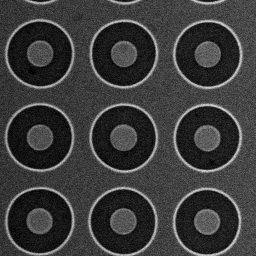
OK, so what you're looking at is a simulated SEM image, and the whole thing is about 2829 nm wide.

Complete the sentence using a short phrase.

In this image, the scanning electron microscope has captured an array of small figures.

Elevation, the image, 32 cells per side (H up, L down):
HHHHHHHHHHHHHHHHHHHHHHHHHHHHHHHH
HHHHHHHHHHHHHHHHHHHHHHHHHHHHHHHH
HHHHHHHHHHHHHHHHHHHHHHHHHHHHHHHH
HHLLLLLLHHHHHLLLLLHHHHHHLLLLHHHH
HHLLLLLLHHHHLLLLLLLHHHHLLLLLLHHH
HLLLHHLLLHHHLLLHLLLHHHLLLLHLLLHH
HLLLHHLLLHHLLLHHHLLLHHLLHHHHLLHH
HLLLHHLLLHHLLLHHHLLHHHLLLHHLLLHH
HLLLLLLLLHHHLLLLLLLHHHLLLLLLLLHH
HHLLLLLLHHHHLLLLLLHHHHHLLLLLLHHH
HHHLLLLHHHHHHHLLLHHHHHHHLLLLHHHH
HHHHHHHHHHHHHHHHHHHHHHHHHHHHHHHH
HHHHHHHHHHHHHHHHHHHHHHHHHHHHHHHH
HHHLLLLHHHHHHHLLLHHHHHHHLLLHHHHH
HHLLLLLLHHHHLLLLLLLHHHHLLLLLLHHH
HLLLLLLLLHHHLLLLLLLHHHLLLLLLLLHH
HLLLHHLLLHHLLLHHHLLHHHLLLHHLLLHH
HLLLHHLLLHHLLLHHHLLLHHLLHHHLLLHH
HLLLHHLLLHHHLLLHLLLHHHLLLHHLLLHH
HHLLLLLLHHHHLLLLLLLHHHHLLLLLLHHH
HHHLLLLHHHHHHLLLLLHHHHHLLLLLHHHH
HHHHHHHHHHHHHHHHHHHHHHHHHHHHHHHH
HHHHHHHHHHHHHHHHHHHHHHHHHHHHHHHH
HHHHHHHHHHHHHHHHHHHHHHHHHHHHHHHH
HHLLLLLLHHHHHLLLLLHHHHHLLLLLHHHH
HLLLLLLLLHHHLLLLLLLHHHHLLLLLLHHH
HLLLHHLLLHHLLLLHLLLHHHLLLHLLLLHH
HLLLHHLLLHHLLLHHHLLHHHLLLHHLLLHH
HLLLHHLLLHHLLLHHHLLHHHLLLHHLLLHH
HLLLLLLLLHHHLLLLLLLHHHLLLLLLLLHH
HHLLLLLLHHHHLLLLLLHHHHHLLLLLLHHH
HHHLLLHHHHHHHHLLLHHHHHHHLLLLHHHH